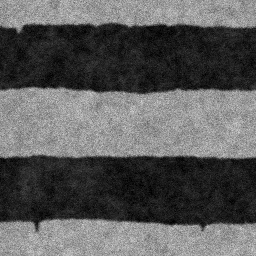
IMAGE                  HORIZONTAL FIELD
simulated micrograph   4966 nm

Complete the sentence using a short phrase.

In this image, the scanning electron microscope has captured one or a few lines or trenches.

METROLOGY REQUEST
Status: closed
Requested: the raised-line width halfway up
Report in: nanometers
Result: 1280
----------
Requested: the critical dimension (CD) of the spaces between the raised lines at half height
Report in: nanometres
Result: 1280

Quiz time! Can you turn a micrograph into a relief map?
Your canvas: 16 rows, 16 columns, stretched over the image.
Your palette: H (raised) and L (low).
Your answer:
HHHHHHHHHHHHHHHH
HHLHLLLLHHHHHHHH
LLLLLLLLLLLLLLLL
LLLLLLLLLLLLLLLL
LLLLLLLLLLLLLLLL
LLLLLLLLLLLLLLLL
HHHHHHHHHHHHHHHH
HHHHHHHHHHHHHHHH
HHHHHHHHHHHHHHHH
HHHHHHHHHHHHHHHH
LLLLLLLLLLLLLLLL
LLLLLLLLLLLLLLLL
LLLLLLLLLLLLLLLL
LLLLLLLLLLLLLLLL
HHHHHHHHHHHHHHHH
HHHHHHHHHHHHHHHH